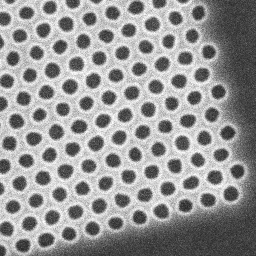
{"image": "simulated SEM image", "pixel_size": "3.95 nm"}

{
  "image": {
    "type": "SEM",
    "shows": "a regular array of holes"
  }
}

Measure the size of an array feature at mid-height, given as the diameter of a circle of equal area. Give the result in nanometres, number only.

62.9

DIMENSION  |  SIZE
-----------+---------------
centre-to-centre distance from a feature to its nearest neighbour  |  91.6 nm